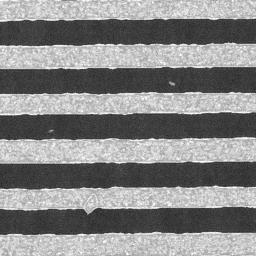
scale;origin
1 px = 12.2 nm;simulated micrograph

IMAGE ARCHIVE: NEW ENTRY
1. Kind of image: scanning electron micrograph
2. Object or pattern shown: lines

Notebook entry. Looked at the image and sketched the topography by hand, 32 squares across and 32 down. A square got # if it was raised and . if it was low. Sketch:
################################
################################
#...............................
................................
................................
............................##..
################################
################################
#######.###..##.................
................................
................................
................................
################################
################################
................................
................................
................................
.............##...#...##########
################################
################################
................................
................................
................................
..............#.......#.########
################################
################################
................................
................................
................................
################################
################################
################################